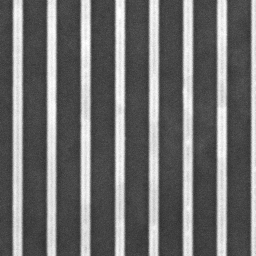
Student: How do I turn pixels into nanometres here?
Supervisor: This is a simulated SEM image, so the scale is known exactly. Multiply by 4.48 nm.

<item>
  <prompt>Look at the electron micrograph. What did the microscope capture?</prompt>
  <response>parallel lines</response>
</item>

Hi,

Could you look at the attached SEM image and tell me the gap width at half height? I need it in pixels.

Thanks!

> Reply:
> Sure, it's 26.7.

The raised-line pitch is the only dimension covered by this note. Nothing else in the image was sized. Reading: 152 nm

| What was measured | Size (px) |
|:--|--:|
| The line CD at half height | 6.74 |